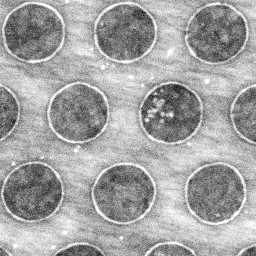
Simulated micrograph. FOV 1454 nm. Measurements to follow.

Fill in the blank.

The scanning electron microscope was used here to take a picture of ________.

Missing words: a regular array of raised bodies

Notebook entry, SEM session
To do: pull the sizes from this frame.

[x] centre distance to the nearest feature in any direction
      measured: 519 nm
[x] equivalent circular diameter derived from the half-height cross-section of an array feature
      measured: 345 nm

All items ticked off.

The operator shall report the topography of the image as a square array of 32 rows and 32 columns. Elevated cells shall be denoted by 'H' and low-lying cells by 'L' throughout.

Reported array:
LLLHHLLLLLLLLLLHHLLLLLLLLLLLLLLL
LHHHHHHLLLLLLHHHHHLLLLLLLHHHHHLL
LHHHHHHHLLLLHHHHHHHLLLLLHHHHHHHL
HHHHHHHHLLLLHHHHHHHLLLLHHHHHHHHL
HHHHHHHHLLLLHHHHHHHLLLLHHHHHHHHL
LHHHHHHHLLLLHHHHHHHLLLLHHHHHHHHL
LHHHHHHLLLLLLHHHHHLLLLLLHHHHHHLL
LLLHHLLLLLLLLLHHHLLLLLLLLHHHHLLL
LLLLLLLLLLLLLLLLLLLLLLLLLLLLLLLL
LLLLLLLLLLLLLLLLLLLLLLLLLLLLLLLL
LLLLLLLLLHHLLLLLLLLLLHLLLLLLLLLL
HLLLLLLHHHHHHLLLLLLHHHHHLLLLLLHH
HHLLLLHHHHHHHLLLLLHHHHHHHLLLLHHH
HHLLLLHHHHHHHLLLLLHHHHHHHLLLLHHH
HHLLLLHHHHHHHHLLLLHHHHHHHLLLLHHH
HHLLLLHHHHHHHLLLLLHHHHHHHLLLLHHH
HLLLLLLHHHHHHLLLLLHHHHHHLLLLLLHH
LLLLLLLLHHHLLLLLLLLHHHHLLLLLLLLH
LLLLLLLLLLLLLLLLLLLLLLLLLLLLLLLL
LLLLLLLLLLLLLLLLLLLLLLLLLLLLLLLL
LLLHHHLLLLLLLLLLLLLLLLLLLLLHLLLL
LHHHHHHLLLLLLHHHHHLLLLLLHHHHHHLL
LHHHHHHHLLLLHHHHHHHLLLLLHHHHHHLL
HHHHHHHHLLLLHHHHHHHLLLLHHHHHHHHL
HHHHHHHHLLLLHHHHHHHLLLLHHHHHHHHL
LHHHHHHLLLLLHHHHHHHLLLLHHHHHHHLL
LHHHHHHLLLLLHHHHHHLLLLLLHHHHHHLL
LLLHHLLLLLLLLLHHHLLLLLLLLHHHHLLL
LLLLLLLLLLLLLLLLLLLLLLLLLLLLLLLL
LLLLLLLLLLLLLLLLLLLLLLLLLLLLLLLL
LLLLLLLLLHLLLLLLLLLLHHLLLLLLLLLL
HLLLLLLHHHHHHLLLLLLHHHHHLLLLLLHH